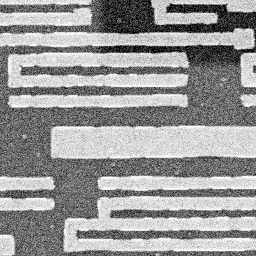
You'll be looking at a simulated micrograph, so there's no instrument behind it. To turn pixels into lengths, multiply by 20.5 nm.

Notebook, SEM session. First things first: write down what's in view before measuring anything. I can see wiring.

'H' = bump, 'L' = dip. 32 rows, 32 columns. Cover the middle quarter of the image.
LLLLLLLLLLLLLLLLLLLLLLLLLLLLLLLL
LLLLLLLLLLLLLLLLLLLLLLLLLLLLLLLL
LLLLLLLLLLLLLLLLLLLLLLLLLLLLLLLL
HHHHHHHHHHHHHHHHHHHHHHHHHHHHHHHL
HHHHHHHHHHHHHHHHHHHHHHHHHHHHHHHL
LLLLLLLLLLLLLLLLLLLLLLLLLLLLLLLL
LLLLLLLLLLLLLLLLLLLLLLLLLLLLLLLL
LLLLLLLLLLLLLLLLLLLLLLLLLLLLLLLL
HHHHHHHHHHHHHHHHHHHHHHHHHHHHHHHL
HHHHHHHHHHHHHHHHHHHHHHHHHHHHHHHL
LLLLLLLLLLLLLLLLLLLLLLLLLLLLLLLL
LLLLLLLLLLLLLLLLLLLLLLLLLLLLLLLL
LLLLLLLLLLLLLLLLLLLLLLLLLLLLLLLL
LLLLLLLLLLLLLLLLLLLLLLLLLLLLLLLL
LLLLLLLLLLLLLLLLLLLLLLLLLLLLLLLL
LLLLLLLLLLLLLLLLLLLLLLLLLLLLLLLL
HHHHHHHHHHHHHHHHHHHHHHHHHHHHHHHH
HHHHHHHHHHHHHHHHHHHHHHHHHHHHHHHH
HHHHHHHHHHHHHHHHHHHHHHHHHHHHHHHH
HHHHHHHHHHHHHHHHHHHHHHHHHHHHHHHH
HHHHHHHHHHHHHHHHHHHHHHHHHHHHHHHH
HHHHHHHHHHHHHHHHHHHHHHHHHHHHHHHH
HHHHHHHHHHHHHHHHHHHHHHHHHHHHHHHH
LLLLLLLLLLLLLLLLLLLLLLLLLLLLLLLL
LLLLLLLLLLLLLLLLLLLLLLLLLLLLLLLL
LLLLLLLLLLLLLLLLLLLLLLLLLLLLLLLL
LLLLLLLLLLLLLLLLLLLLLLLLLLLLLLLL
LLLLLLLLLLLLLLLLLLLLLLLLLLLLLLLL
LLLLLLLLLLLLLLLLLLLLLLLLLLLLLLLL
LLLLLLLLLHHHHHHHHHHHHHHHHHHHHHHH
LLLLLLLLLHHHHHHHHHHHHHHHHHHHHHHH
LLLLLLLLLLLLLLLLLLLLLLLLLLLLLLLL